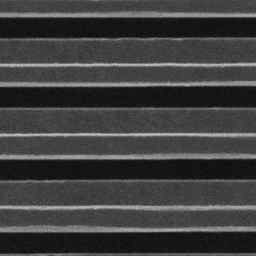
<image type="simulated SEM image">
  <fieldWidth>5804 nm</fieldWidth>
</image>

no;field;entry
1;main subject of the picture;lines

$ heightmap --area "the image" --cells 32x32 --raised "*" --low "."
********************************
********************************
................................
................................
................................
********************************
********************************
********************************
********************************
********************************
********************************
................................
................................
................................
********************************
********************************
********************************
********************************
********************************
********************************
................................
................................
................................
********************************
********************************
********************************
********************************
********************************
********************************
................................
................................
................................